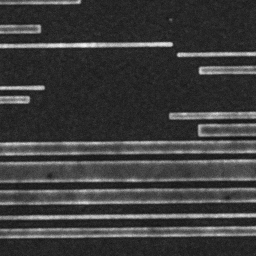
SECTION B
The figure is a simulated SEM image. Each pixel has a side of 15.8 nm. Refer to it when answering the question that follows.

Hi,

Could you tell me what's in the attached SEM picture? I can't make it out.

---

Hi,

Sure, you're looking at groups of lines, slits or small figures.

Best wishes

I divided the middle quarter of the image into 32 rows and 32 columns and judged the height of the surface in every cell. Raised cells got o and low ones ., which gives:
................................
................................
................................
................................
................................
................................
................................
................................
................................
................................
................................
................................
................................
...........................ooooo
................................
................................
................................
................................
................................
................................
oooooooooooooooooooooooooooooooo
oooooooooooooooooooooooooooooooo
................................
................................
..................oooooooooooooo
oooooooooooooooooooooooooooooooo
oooooooooooooooooooooooooooooooo
oooooooooooooooooooooooooooooooo
oooooooooooooooooooooooooooooooo
................................
................................
......................oooo..oooo